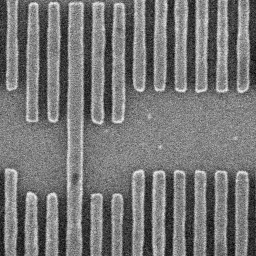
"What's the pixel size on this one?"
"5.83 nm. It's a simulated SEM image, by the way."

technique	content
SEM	wiring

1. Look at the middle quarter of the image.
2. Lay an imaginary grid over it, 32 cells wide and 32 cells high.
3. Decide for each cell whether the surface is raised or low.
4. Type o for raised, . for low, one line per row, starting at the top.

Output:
.oooo..ooo..ooo...oo...oo...oo..
.oooo..ooo..ooo..ooo...oo...oo..
.oooo..ooo..ooo..ooo...oo...oo..
.oooo..ooo..ooo..ooo...oo...oo..
.oooo..ooo..ooo...oo...oo...oo..
.oooo..ooo..ooo...oo...oo...oo..
.oooo..ooo..ooo....o........oo..
.oooo..ooo..ooo.................
.oooo..ooo..ooo.................
.oooo..ooo..ooo.................
.oooo..ooo..ooo.................
.oooo..ooo..ooo.................
.oooo..ooo..ooo.................
.oooo..ooo..ooo.................
.oooo..ooo...o..................
.oooo...........................
.ooo............................
.ooo............................
.ooo............................
.ooo............................
.ooo............................
.ooo............................
.ooo............................
.ooo............................
.ooo............................
.ooo............................
.ooo............................
.ooo.............ooo...oo...oo..
.ooo.............ooo...oo...oo..
.ooo.............ooo..ooo...oo..
.ooo.............ooo..ooo...oo..
.ooo.............ooo..ooo...oo..